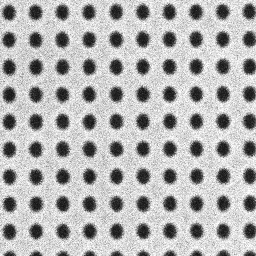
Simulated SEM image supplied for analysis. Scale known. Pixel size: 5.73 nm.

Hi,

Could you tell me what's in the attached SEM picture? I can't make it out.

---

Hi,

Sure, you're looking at a regular array of holes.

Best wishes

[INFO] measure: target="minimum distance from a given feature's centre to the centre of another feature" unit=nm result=152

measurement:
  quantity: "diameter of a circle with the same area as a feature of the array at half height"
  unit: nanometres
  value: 91.7